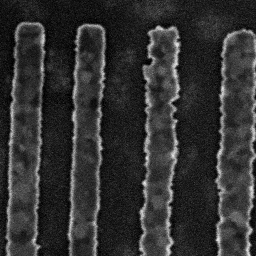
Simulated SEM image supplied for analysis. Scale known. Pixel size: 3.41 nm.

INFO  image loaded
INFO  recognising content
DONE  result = one or a few lines or trenches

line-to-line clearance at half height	152	nm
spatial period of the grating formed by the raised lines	69.7	px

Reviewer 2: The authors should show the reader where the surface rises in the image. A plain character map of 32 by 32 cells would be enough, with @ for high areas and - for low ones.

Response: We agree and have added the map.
--------------------------------
--------------------------------
--------------------------------
--@@@-----@@@--------@----------
--@@@-----@@@------@@@-------@@@
--@@@-----@@@------@@@------@@@@
--@@@@----@@@------@@@------@@@@
--@@@-----@@@------@@@------@@@@
--@@@----@@@@-----@@@@------@@@@
--@@@----@@@@-----@@@@------@@@@
--@@@----@@@@-----@@@@------@@@@
-@@@@----@@@@-----@@@@------@@@@
--@@@----@@@@-----@@@@------@@@@
-@@@@----@@@@-----@@@@------@@@@
-@@@@----@@@@-----@@@@------@@@@
-@@@@----@@@------@@@@------@@@@
-@@@@----@@@------@@@@------@@@@
-@@@@----@@@@-----@@@@------@@@@
-@@@@----@@@@-----@@@@------@@@@
-@@@@----@@@@-----@@@@-----@@@@@
-@@@@----@@@@-----@@@@-----@@@@@
-@@@@----@@@------@@@@-----@@@@-
-@@@@----@@@------@@@------@@@@@
-@@@@----@@@------@@@------@@@@@
-@@@@----@@@------@@@------@@@@@
-@@@@----@@@------@@@------@@@@-
-@@@@----@@@------@@@------@@@@-
-@@@@----@@@------@@@-------@@@-
-@@@@----@@@------@@@------@@@@-
-@@@@----@@@------@@@------@@@@-
-@@@@----@@@------@@@------@@@@-
-@@@@----@@@------@@@------@@@@-